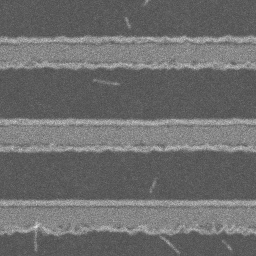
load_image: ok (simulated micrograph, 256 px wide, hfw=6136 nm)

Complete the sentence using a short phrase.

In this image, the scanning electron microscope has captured one or a few lines or trenches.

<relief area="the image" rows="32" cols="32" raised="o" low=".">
oooooooooooooooooooooooooooooooo
oooooooooooooooooooooooooooooooo
oooooooooooooooooooooooooooooooo
oooooooooooooooooooooooooooooooo
oooooooooooooooooooooooooooooooo
................................
................................
................................
oooooooooooooooooooooooooooooooo
oooooooooooooooooooooooooooooooo
oooooooooooooooooooooooooooooooo
oooooooooooooooooooooooooooooooo
oooooooooooooooooooooooooooooooo
oooooooooooooooooooooooooooooooo
oooooooooooooooooooooooooooooooo
................................
................................
................................
......................o..o.o....
oooooooooooooooooooooooooooooooo
oooooooooooooooooooooooooooooooo
oooooooooooooooooooooooooooooooo
oooooooooooooooooooooooooooooooo
oooooooooooooooooooooooooooooooo
oooooooooooooooooooooooooooooooo
................................
................................
................................
....o......o..........o.........
oooooooooooooooooooooooooooooooo
oooooooooooooooooooooooooooooooo
oooooooooooooooooooooooooooooooo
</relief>